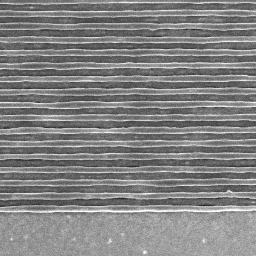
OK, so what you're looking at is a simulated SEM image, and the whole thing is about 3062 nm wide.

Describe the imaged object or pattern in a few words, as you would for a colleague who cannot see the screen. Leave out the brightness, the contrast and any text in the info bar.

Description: parallel lines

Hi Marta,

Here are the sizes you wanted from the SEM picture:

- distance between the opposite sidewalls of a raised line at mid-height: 0.0702 micrometres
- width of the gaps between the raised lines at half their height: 0.0822 µm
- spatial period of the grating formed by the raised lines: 156 nm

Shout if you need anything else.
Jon